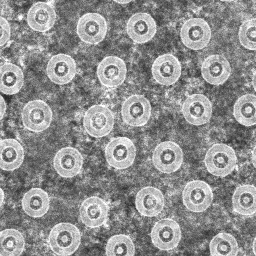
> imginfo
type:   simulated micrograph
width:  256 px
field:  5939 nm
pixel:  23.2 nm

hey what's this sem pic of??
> a regular array of ring-shaped raised bodies with a dot in the middle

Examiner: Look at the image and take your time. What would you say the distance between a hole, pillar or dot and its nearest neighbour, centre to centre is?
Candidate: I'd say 1070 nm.